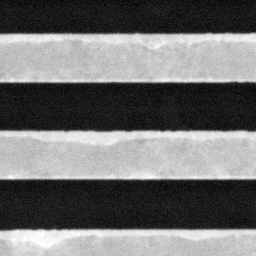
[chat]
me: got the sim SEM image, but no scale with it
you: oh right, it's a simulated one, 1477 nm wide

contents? lines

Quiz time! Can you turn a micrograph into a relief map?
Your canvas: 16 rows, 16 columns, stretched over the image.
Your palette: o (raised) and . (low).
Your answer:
................
................
ooooooooo.oooooo
oooooooooooooooo
oooooooooooooooo
................
................
................
ooo.o..ooooooooo
oooooooooooooooo
oooooooooooooooo
................
................
................
..............oo
oooooooooooooooo